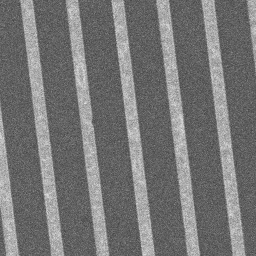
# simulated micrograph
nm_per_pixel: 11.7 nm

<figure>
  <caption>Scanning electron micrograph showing parallel lines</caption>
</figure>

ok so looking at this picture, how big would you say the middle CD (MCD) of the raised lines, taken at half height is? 140 nanometers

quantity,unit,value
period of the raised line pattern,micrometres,0.527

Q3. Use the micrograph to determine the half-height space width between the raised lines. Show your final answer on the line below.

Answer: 387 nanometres